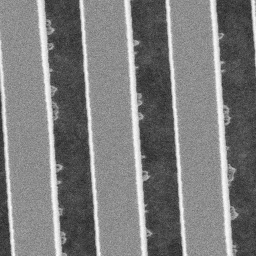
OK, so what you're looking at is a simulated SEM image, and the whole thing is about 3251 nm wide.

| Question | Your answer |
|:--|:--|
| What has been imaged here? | lines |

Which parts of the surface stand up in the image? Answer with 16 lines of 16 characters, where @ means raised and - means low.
@@@--@@@--@@@---
@@@--@@@--@@@---
@@@--@@@---@@@--
@@@--@@@---@@@--
@@@--@@@---@@@--
@@@--@@@---@@@--
@@@--@@@---@@@--
@@@---@@@--@@@--
@@@---@@@--@@@--
@@@---@@@--@@@--
@@@---@@@--@@@--
@@@---@@@--@@@--
-@@@--@@@--@@@--
-@@@--@@@--@@@--
-@@@--@@@--@@@--
-@@@--@@@--@@@--